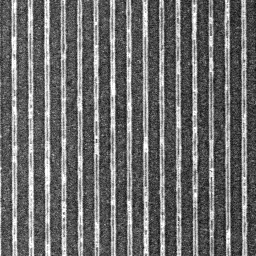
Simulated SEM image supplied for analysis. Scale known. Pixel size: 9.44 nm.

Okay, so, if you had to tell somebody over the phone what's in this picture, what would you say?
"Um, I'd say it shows parallel lines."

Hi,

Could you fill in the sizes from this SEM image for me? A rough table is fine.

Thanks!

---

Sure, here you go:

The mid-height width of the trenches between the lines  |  124 nanometers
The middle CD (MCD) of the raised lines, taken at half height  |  35.4 nm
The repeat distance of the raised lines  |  155 nanometers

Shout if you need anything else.